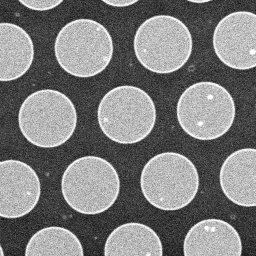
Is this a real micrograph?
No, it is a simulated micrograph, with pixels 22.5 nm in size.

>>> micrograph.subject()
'an array of small figures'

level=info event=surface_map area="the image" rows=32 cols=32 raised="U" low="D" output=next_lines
DDDUUUUDDDDDDDUUDDDDDDDDDDDDDDDD
DDDDDDDDDDDDDDDDDDDDDDDDDDDDDDDD
DDDDDDDDDDUDDDDDDDUUUUDDDDDDUUUU
UUDDDDDDUUUUUDDDDUUUUUUDDDDUUUUU
UUUDDDDUUUUUUUDDDUUUUUUUDDDUUUUU
UUUUDDDUUUUUUUDDDUUUUUUUDDDUUUUU
UUUUDDDUUUUUUUDDDUUUUUUUDDDUUUUU
UUUUDDDUUUUUUUDDDUUUUUUDDDDDUUUU
UUUDDDDDUUUUUDDDDDUUUUDDDDDDDUUD
UUDDDDDDDDUDDDDDDDDDDDDDDDDDDDDD
DDDDDDDDDDDDDDDDDDDDDDDDDUUDDDDD
DDDDDUUDDDDDDDUUUUDDDDDUUUUUDDDD
DDDUUUUUUDDDDUUUUUUDDDUUUUUUUDDD
DDDUUUUUUDDDUUUUUUUDDDUUUUUUUDDD
DDUUUUUUUDDDUUUUUUUDDDUUUUUUUDDD
DDUUUUUUUDDDUUUUUUUDDDDUUUUUUDDD
DDDUUUUUUDDDDUUUUUUDDDDUUUUUDDDD
DDDDUUUUDDDDDDUUUUDDDDDDDDDDDDDD
DDDDDDDDDDDDDDDDDDDDDDDDDDDDDDDD
DDDDDDDDDDDDDDDDDDDDUUUDDDDDDUUU
UUUDDDDDDUUUUUDDDDUUUUUUDDDDUUUU
UUUUDDDDUUUUUUDDDDUUUUUUUDDDUUUU
UUUUUDDDUUUUUUUDDDUUUUUUUDDDUUUU
UUUUUDDDUUUUUUUDDDUUUUUUUDDDUUUU
UUUUUDDDUUUUUUUDDDUUUUUUDDDDUUUU
UUUUDDDDDUUUUUDDDDDUUUUDDDDDDDUU
UUUUDDDDDDUUUDDDDDDDDDDDDDDDDDDD
DDDDDDDDDDDDDDDDDDDDDDDDDDUDDDDD
DDDDDDUUDDDDDDDUUUUDDDDDUUUUUDDD
DDDDUUUUUDDDDDUUUUUUDDDUUUUUUUDD
DDDDUUUUUUDDDUUUUUUUDDDUUUUUUUDD
DDDUUUUUUUDDDUUUUUUUDDDUUUUUUUDD